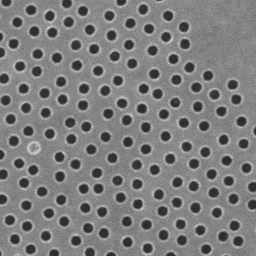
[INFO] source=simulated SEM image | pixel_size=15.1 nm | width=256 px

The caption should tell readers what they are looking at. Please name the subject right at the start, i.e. a regular array of holes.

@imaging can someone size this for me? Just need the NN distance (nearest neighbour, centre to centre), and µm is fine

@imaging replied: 0.274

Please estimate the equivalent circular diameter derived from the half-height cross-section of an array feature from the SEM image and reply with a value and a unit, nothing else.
10.9 pixels